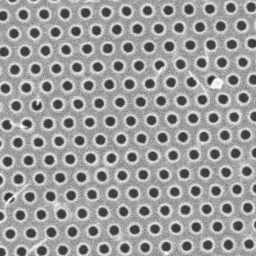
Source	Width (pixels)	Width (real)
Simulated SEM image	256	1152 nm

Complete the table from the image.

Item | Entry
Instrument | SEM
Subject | a regular array of holes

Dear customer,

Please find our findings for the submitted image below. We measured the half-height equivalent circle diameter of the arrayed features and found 0.0495 µm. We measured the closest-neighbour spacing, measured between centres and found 92 nm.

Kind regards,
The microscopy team